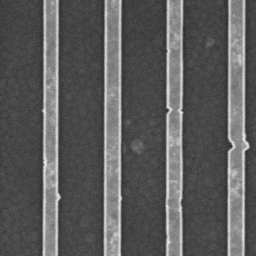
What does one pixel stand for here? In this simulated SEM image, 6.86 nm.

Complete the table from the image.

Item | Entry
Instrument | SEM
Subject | one or a few lines or trenches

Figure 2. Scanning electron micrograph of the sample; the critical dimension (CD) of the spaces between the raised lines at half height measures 0.328 micrometres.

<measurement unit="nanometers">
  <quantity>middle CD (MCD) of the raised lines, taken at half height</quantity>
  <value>103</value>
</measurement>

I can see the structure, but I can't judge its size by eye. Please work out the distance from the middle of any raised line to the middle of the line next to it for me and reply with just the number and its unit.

425 nanometres